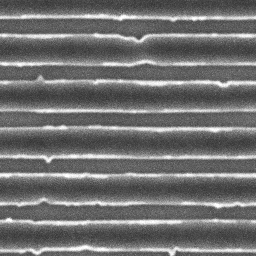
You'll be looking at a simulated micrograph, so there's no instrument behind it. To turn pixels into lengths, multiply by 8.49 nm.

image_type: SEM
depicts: parallel lines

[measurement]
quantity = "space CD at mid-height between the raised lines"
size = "135 nm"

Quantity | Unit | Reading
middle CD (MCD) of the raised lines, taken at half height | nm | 263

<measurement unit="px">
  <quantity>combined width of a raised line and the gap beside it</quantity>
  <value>46.5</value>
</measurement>